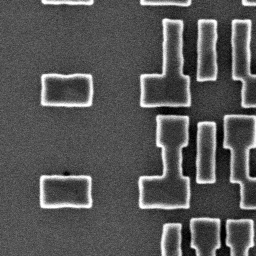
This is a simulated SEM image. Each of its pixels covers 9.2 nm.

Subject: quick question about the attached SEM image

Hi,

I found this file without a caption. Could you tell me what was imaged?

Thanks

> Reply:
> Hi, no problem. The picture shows wiring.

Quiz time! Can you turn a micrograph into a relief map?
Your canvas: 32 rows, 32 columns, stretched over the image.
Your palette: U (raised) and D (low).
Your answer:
DDDDDDDDDDUDDDDDDDUUUUUUDDDDDDUU
DDDDDDDDDDDDDDDDDDDDDDDDDDDDDDDD
DDDDDDDDDDDDDDDDDDDDDDDDDDDDDDDD
DDDDDDDDDDDDDDDDDDDDUUUDDUUDDUUD
DDDDDDDDDDDDDDDDDDDDDUUDDUUDDUUD
DDDDDDDDDDDDDDDDDDDDUUUDDUUDDUUD
DDDDDDDDDDDDDDDDDDDDUUUDDUUDDUUD
DDDDDDDDDDDDDDDDDDDDUUUDDUUDDUUD
DDDDDDDDDDDDDDDDDDDDUUUDDUUDDUUD
DDDDDDUUUUUDDDDDDDUUUUUDDUUDDUUU
DDDDDUUUUUUDDDDDDDUUUUUUDDDDDDUU
DDDDDUUUUUUUDDDDDDUUUUUUDDDDDDUU
DDDDDUUUUUUDDDDDDDUUUUUUDDDDDDUU
DDDDDDDDDDDDDDDDDDDDDDDDDDDDDDDD
DDDDDDDDDDDDDDDDDDDDUUDDDDDDUUUD
DDDDDDDDDDDDDDDDDDDDUUUDDUUDUUUU
DDDDDDDDDDDDDDDDDDDDUUUDDUUDUUUU
DDDDDDDDDDDDDDDDDDDDUUUDDUUDUUUU
DDDDDDDDDDDDDDDDDDDDUUUDDUUDUUUU
DDDDDDDDDDDDDDDDDDDDUUUDDUUDDUUD
DDDDDDDDDDDDDDDDDDDDUUUDDUUDDUUD
DDDDDDDDDDDDDDDDDDDDUUUDDUUDDUUD
DDDDDUUUUUUDDDDDDDUUUUUUDUUDDUUU
DDDDDUUUUUUDDDDDDUUUUUUUDDDDDDUU
DDDDDUUUUUUDDDDDDDUUUUUUDDDDDDUU
DDDDDUUUUUUDDDDDDDUUUUUUDDDDDDUU
DDDDDDDDDDDDDDDDDDDDDDDDDDDDDDDD
DDDDDDDDDDDDDDDDDDDDDDDDUUUDDDDD
DDDDDDDDDDDDDDDDDDDDUUUDUUUDUUUU
DDDDDDDDDDDDDDDDDDDDUUUDUUUDUUUU
DDDDDDDDDDDDDDDDDDDDUUUDUUUDUUUU
DDDDDDDDDDDDDDDDDDDDUUUDDUUDDUUD